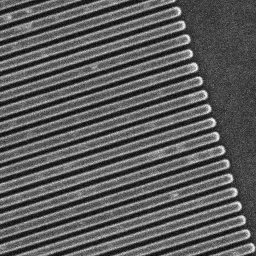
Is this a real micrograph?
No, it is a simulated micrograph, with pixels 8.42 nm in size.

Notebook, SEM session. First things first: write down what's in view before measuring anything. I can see parallel lines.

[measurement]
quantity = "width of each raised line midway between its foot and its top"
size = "69.4 nm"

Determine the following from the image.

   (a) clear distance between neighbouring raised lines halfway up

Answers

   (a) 54.3 nm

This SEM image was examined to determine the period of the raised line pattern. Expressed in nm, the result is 122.